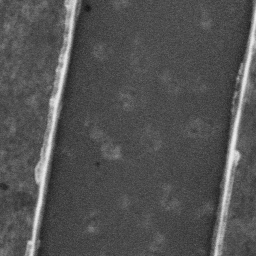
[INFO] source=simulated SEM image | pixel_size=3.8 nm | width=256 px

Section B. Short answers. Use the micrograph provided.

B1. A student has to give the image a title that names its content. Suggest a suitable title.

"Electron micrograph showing one or a few lines or trenches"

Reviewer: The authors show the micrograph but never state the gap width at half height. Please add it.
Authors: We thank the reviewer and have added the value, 686 nm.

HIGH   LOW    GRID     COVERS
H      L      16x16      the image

HHHHHLLLLLLLLLLL
HHHHLLLLLLLLLLLL
HHHHLLLLLLLLLLLL
HHHHLLLLLLLLLLLL
HHHHLLLLLLLLLLLH
HHHHLLLLLLLLLLLH
HHHHLLLLLLLLLLLH
HHHLLLLLLLLLLLLH
HHHLLLLLLLLLLLLH
HHHLLLLLLLLLLLHH
HHHLLLLLLLLLLLHH
HHHLLLLLLLLLLLHH
HHLLLLLLLLLLLLHH
HHLLLLLLLLLLLLHH
HHLLLLLLLLLLLLHH
HHLLLLLLLLLLLLHH